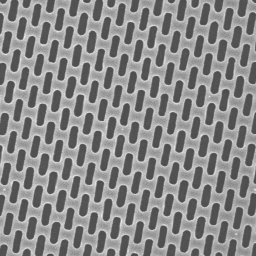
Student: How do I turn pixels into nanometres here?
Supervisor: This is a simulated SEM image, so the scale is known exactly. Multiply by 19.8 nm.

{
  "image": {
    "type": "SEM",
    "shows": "a regular array of holes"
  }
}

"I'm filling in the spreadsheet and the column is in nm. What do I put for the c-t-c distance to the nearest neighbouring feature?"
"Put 391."